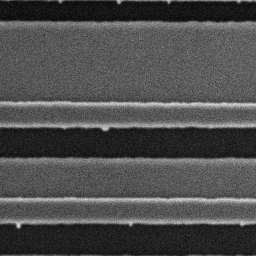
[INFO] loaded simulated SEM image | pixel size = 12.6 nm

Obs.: lines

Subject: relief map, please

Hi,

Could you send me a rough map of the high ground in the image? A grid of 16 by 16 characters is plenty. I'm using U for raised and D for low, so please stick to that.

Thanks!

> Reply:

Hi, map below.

DDDDDDDDDDDDDDDD
UUUUUUUUUUUUUUUU
UUUUUUUUUUUUUUUU
UUUUUUUUUUUUUUUU
UUUUUUUUUUUUUUUU
UUUUUUUUUUUUUUUU
UUUUUUUUUUUUUUUU
UUUUUUUUUUUUUUUU
DDDDDDDDDDDDDDDD
DDDDDDDDDDDDDDDD
UUUUUUUUUUUUUUUU
UUUUUUUUUUUUUUUU
UUUUUUUUUUUUUUUU
UUUUUUUUUUUUUUUU
DDDDDDDDDDDDDDDD
DDDDDDDDDDDDDDDD